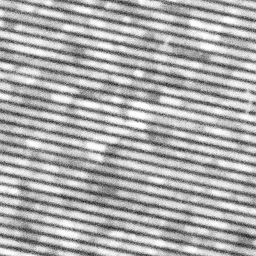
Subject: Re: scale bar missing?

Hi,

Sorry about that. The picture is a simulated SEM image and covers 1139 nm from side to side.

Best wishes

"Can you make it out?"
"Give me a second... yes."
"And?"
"parallel lines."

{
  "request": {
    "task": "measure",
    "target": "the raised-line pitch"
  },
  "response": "0.0449 µm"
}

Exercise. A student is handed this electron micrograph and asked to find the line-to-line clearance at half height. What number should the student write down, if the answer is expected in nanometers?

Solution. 24.5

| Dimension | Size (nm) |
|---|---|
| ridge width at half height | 20.1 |